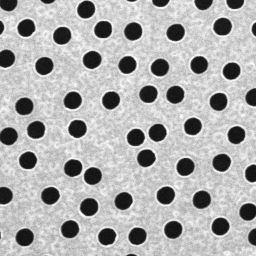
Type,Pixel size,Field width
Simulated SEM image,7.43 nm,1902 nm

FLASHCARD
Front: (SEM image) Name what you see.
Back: a regular array of holes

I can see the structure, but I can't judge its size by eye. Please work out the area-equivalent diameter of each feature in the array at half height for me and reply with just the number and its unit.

135 nm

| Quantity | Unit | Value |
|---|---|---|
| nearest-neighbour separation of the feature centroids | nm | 237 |